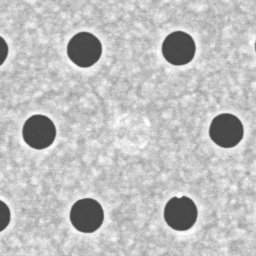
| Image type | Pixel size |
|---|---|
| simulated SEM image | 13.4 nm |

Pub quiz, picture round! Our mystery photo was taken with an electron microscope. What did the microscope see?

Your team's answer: holes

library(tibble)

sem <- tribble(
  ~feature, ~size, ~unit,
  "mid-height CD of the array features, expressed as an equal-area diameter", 468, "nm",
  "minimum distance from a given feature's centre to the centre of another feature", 1.26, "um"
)